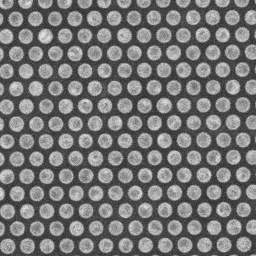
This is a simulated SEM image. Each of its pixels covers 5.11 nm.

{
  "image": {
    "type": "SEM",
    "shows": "a regular array of raised bodies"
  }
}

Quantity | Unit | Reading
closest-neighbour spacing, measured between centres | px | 19.5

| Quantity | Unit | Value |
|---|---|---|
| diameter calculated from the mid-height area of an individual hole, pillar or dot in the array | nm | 70.7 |